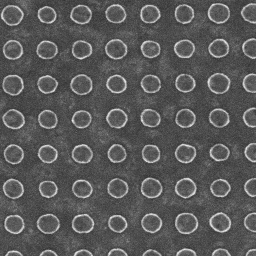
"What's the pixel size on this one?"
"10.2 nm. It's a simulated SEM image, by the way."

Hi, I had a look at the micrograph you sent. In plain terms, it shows a regular array of raised bodies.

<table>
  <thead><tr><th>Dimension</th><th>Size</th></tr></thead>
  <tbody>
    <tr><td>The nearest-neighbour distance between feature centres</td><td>348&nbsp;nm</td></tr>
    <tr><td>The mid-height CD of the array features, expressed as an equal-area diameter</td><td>192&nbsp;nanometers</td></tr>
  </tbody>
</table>